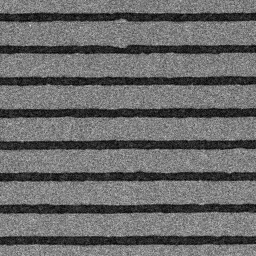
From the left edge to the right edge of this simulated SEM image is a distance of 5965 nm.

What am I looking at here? parallel lines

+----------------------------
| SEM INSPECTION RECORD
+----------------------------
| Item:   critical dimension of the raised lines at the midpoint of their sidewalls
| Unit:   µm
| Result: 0.527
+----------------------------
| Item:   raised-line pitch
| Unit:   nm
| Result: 743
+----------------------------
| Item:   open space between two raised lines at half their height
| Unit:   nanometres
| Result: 218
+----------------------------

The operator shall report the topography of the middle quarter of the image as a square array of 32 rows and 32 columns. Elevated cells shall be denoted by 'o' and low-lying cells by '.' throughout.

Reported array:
oooooooooooooooooooooooooooooooo
oooooooooooooooooooooooooooooooo
oooooooooooooooooooooooooooooooo
................................
................................
......................oo.o.....o
oooooooooooooooooooooooooooooooo
oooooooooooooooooooooooooooooooo
oooooooooooooooooooooooooooooooo
oooooooooooooooooooooooooooooooo
oooooooooooooooooooooooooooooooo
................................
................................
oo..............................
oooooooooooooooooooooooooooooooo
oooooooooooooooooooooooooooooooo
oooooooooooooooooooooooooooooooo
oooooooooooooooooooooooooooooooo
oooooooooooooooooooooooooooooooo
................................
................................
................ooooo.oo..o..ooo
oooooooooooooooooooooooooooooooo
oooooooooooooooooooooooooooooooo
oooooooooooooooooooooooooooooooo
oooooooooooooooooooooooooooooooo
oooooooooooooooooooooooooooooooo
................................
................................
.........o.ooooooooooooooooooooo
oooooooooooooooooooooooooooooooo
oooooooooooooooooooooooooooooooo